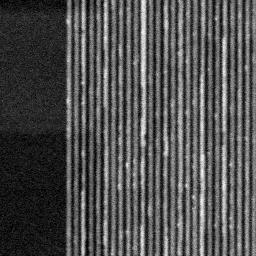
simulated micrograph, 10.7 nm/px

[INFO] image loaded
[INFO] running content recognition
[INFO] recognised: parallel lines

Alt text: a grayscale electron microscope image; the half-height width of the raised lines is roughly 37.4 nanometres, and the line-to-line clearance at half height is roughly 0.0454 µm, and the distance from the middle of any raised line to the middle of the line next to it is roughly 79.2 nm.